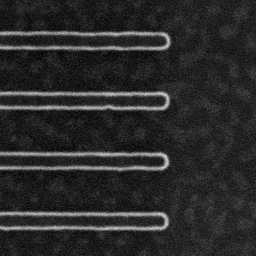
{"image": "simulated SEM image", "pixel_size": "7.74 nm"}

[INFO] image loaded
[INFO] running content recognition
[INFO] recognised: parallel lines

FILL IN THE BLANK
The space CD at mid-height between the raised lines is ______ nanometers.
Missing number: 350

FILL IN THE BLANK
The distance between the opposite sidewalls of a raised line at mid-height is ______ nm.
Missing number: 114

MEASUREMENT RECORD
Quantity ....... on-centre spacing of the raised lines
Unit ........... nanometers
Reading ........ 466